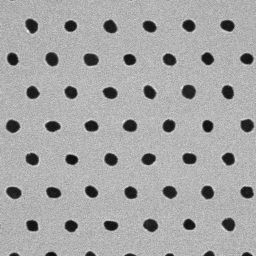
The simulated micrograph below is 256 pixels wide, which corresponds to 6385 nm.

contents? a regular array of holes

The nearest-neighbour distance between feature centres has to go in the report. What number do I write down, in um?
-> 0.95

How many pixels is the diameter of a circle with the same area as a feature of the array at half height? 13.1